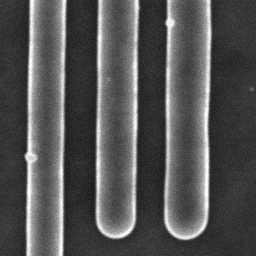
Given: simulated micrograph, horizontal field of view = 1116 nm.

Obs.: groups of lines, slits or small figures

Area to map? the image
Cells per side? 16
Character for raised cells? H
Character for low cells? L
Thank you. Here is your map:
LLHHLLHHHLLHHLLL
LLHHLLHHHLHHHLLL
LLHHLLHHHLLHHLLL
LLHHLLHHHLLHHLLL
LLHHLLHHHLHHHLLL
LLHHLLHHHLHHHLLL
LLHHLLHHHLHHHLLL
LLHHLLHHHLHHHLLL
LLHHLLHHLLHHHLLL
LLHHLLHHLLHHHLLL
LLHHLLHHLLHHHLLL
LLHHLLHHLLHHHLLL
LLHHLLHHLLHHHLLL
LLHHLLHHLLHHHLLL
LLHHLLLHLLLHLLLL
LLHHLLLLLLLLLLLL